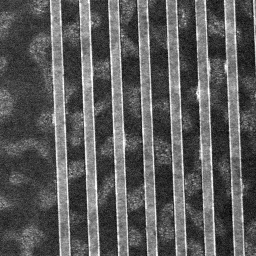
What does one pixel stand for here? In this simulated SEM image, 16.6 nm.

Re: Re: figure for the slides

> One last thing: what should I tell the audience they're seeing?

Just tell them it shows parallel lines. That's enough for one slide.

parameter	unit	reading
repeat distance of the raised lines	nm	483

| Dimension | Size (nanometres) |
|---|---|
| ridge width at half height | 156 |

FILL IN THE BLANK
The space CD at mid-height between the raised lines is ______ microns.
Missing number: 0.322